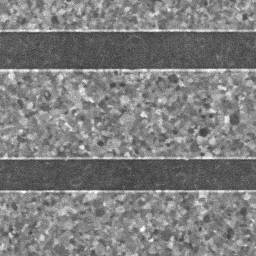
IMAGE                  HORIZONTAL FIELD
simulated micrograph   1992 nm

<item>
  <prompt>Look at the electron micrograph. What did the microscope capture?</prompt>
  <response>one or a few lines or trenches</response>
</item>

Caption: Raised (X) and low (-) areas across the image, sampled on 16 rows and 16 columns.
XXXXXXXXXXXXXXXX
XXXXXXXXXXXXXXXX
----------------
----------------
XXXXXXXXXXXXXXXX
XXXXXXXXXXXXXXXX
XXXXXXXXXXXXXXXX
XXXXXXXXXXXXXXXX
XXXXXXXXXXXXXXXX
XXXXXXXXXXXXXXXX
----------------
----------------
XXXXXXXXXXXXXXXX
XXXXXXXXXXXXXXXX
XXXXXXXXXXXXXXXX
XXXXXXXXXXXXXXXX